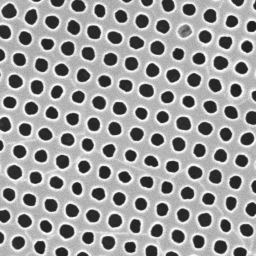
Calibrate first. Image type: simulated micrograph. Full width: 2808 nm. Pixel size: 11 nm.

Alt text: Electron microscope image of a regular array of holes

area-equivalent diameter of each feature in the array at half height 149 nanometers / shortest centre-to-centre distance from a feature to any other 234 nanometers